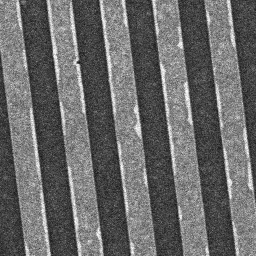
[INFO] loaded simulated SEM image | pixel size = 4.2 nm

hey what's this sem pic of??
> parallel lines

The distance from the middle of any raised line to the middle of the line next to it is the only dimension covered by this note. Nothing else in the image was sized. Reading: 220 nanometres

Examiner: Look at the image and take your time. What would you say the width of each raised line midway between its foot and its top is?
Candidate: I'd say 104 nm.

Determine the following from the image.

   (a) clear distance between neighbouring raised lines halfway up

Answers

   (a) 116 nm